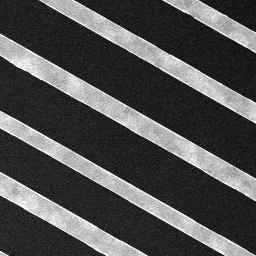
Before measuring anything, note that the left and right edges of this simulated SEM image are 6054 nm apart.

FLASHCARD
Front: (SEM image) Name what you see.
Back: one or a few lines or trenches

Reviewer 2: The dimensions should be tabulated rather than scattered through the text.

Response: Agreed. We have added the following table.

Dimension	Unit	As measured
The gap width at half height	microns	1.13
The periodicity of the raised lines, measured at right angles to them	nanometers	1500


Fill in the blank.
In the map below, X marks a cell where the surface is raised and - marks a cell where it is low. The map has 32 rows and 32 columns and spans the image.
------XXXX-----------XXXXX------
--------XXXX-----------XXXX-----
---------XXXX------------XXXX---
-----------XXXX------------XXXX-
-------------XXXX-----------XXXX
XX-------------XXXX-----------XX
XXXX------------XXXXX-----------
-XXXXX------------XXXX----------
---XXXXX------------XXXX--------
----XXXXX-------------XXXX------
------XXXXX------------XXXXX----
--------XXXXX------------XXXX---
----------XXXXX------------XXXX-
------------XXXX-------------XXX
X------------XXXXX------------XX
XXX------------XXXXX------------
-XXXX------------XXXXX----------
---XXX-------------XXXX---------
-----XXX------------XXXXX-------
------XXXX------------XXXXX-----
--------XXXX------------XXXXX---
----------XXXX------------XXXX--
XX----------XXX------------XXXXX
XXX----------XXXX------------XXX
XXXXX----------XXXX------------X
--XXXXX----------XXXX-----------
----XXXXX----------XXX----------
------XXXX----------XXXX--------
-------XXXXX----------XXXX------
---------XXXXX----------XXXX----
-----------XXXXX----------XXX---
------------XXXXXX---------XXXX-